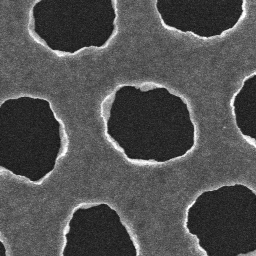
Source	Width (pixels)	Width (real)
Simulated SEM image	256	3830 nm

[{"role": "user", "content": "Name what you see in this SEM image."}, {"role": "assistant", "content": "holes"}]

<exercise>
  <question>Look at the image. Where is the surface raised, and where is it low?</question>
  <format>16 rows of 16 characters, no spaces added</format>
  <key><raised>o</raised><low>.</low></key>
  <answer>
oo.....ooo.....o
oo.....ooo.....o
oo.....ooooooooo
oooooooooooooooo
oooooooooooooooo
ooooooo...ooooo.
...oooo.....ooo.
....ooo.....ooo.
....ooo.....oooo
....oooo....oooo
...ooooooooooooo
oooooooooooooooo
oooooooooooo....
ooooo..ooooo....
oooo....oooo....
oooo....ooooo...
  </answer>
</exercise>